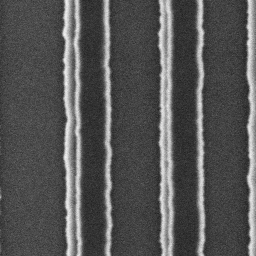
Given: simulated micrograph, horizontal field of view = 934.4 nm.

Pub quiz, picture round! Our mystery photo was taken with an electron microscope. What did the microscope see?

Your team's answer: lines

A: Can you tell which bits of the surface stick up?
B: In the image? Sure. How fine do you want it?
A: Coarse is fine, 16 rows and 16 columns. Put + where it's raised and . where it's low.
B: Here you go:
....+++...+++...
....+++...+++...
....+++...+++...
....+++...+++...
....+++...+++..+
....+++...+++...
....+++...+++...
....+++...+++...
....+++...+++...
....+++...+++...
....+++...+++...
....+++...+++...
....+++...+++...
....+++...+++...
....+++...+++...
....+++...+++...